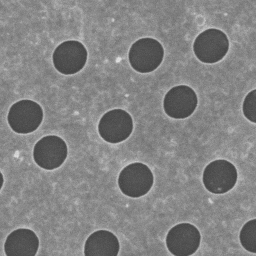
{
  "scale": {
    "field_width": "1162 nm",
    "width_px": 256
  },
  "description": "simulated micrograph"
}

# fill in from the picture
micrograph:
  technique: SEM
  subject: a regular array of holes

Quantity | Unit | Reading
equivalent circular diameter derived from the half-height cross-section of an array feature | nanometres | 160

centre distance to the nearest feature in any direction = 263 nanometres